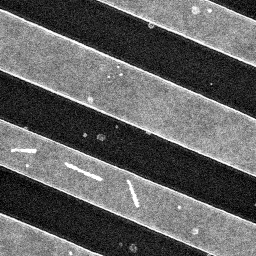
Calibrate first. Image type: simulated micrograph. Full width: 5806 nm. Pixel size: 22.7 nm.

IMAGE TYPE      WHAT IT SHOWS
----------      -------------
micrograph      lines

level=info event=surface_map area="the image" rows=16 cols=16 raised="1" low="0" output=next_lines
0000000111111100
1100000000111111
1111000000001111
1111111000000011
1111111110000000
0001111111100000
0000011111111100
0000000011111111
1110000000111111
1111100000001111
1111111000000001
0001111111000000
0000011111110000
0000000011111110
1110000000111111
1111100000001111